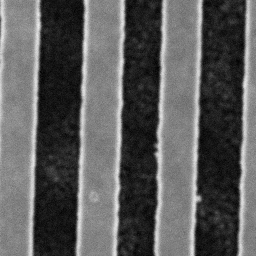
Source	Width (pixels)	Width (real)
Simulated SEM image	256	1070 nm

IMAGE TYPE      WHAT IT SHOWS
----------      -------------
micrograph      lines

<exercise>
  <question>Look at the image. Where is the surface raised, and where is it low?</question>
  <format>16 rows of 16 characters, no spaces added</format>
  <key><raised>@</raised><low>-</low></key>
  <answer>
@@---@@@--@@@--@
@@---@@@--@@@--@
@@---@@@--@@@--@
@@---@@@--@@@--@
@@---@@@--@@---@
@@---@@@--@@---@
@@---@@@--@@---@
@@---@@@--@@---@
@@---@@@--@@---@
@@---@@@--@@---@
@@---@@---@@---@
@@---@@---@@---@
@@---@@---@@---@
@@---@@---@@---@
@@---@@---@@---@
@@---@@---@@---@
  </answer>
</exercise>